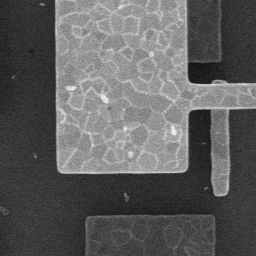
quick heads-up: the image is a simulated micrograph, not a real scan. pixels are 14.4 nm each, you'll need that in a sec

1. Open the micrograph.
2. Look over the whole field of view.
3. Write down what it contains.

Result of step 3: wiring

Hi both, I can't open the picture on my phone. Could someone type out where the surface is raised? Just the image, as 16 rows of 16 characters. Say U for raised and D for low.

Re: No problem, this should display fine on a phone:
DDDUUUUUUUUUDDDD
DDDUUUUUUUUUDDDD
DDDUUUUUUUUUDDDD
DDDUUUUUUUUUDDDD
DDDUUUUUUUUUDDDD
DDDDUUUUUUUUUUUU
DDDDUUUUUUUUUUUU
DDDDUUUUUUUUDDDD
DDDDUUUUUUUUDDDD
DDDDUUUUUUUUDDDD
DDDDUUUUUUUUDDDD
DDDDDDDDDDDDDDDD
DDDDDDDDDDDDDDDD
DDDDDDDDDDDDDDDD
DDDDDDDDDDDDDDDD
DDDDDDDDDDDDDDDD